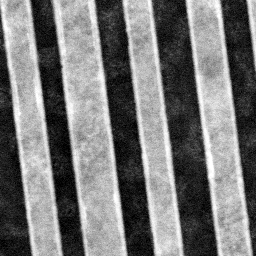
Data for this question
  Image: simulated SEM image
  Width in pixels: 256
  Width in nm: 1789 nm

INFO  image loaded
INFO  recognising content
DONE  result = one or a few lines or trenches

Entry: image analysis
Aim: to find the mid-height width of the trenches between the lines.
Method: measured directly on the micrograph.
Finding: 219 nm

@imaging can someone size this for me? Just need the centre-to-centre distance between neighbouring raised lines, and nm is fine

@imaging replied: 435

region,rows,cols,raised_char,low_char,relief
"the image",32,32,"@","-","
@@@----@@@@@----@@@-----@@@----@
@@@@---@@@@@----@@@-----@@@----@
-@@@---@@@@@----@@@-----@@@@---@
-@@@---@@@@@----@@@-----@@@@----
-@@@---@@@@@----@@@-----@@@@----
-@@@----@@@@----@@@-----@@@@----
-@@@----@@@@----@@@-----@@@@----
-@@@----@@@@-----@@@----@@@@----
-@@@@---@@@@@----@@@-----@@@----
-@@@@---@@@@@----@@@-----@@@----
--@@@---@@@@@----@@@-----@@@@---
--@@@---@@@@@----@@@-----@@@@---
--@@@---@@@@@----@@@-----@@@@---
--@@@----@@@@----@@@-----@@@@---
--@@@----@@@@----@@@-----@@@@---
--@@@----@@@@@---@@@@----@@@@---
--@@@@---@@@@@----@@@-----@@@---
--@@@@---@@@@@----@@@-----@@@---
---@@@---@@@@@----@@@-----@@@@--
---@@@---@@@@@----@@@-----@@@@--
---@@@---@@@@@----@@@-----@@@@--
---@@@----@@@@----@@@-----@@@@--
---@@@----@@@@----@@@-----@@@@--
---@@@----@@@@@---@@@@-----@@@--
---@@@@---@@@@@----@@@-----@@@--
---@@@@---@@@@@----@@@-----@@@--
----@@@---@@@@@----@@@-----@@@@-
----@@@---@@@@@----@@@-----@@@@-
----@@@---@@@@@----@@@-----@@@@-
----@@@----@@@@----@@@-----@@@@-
----@@@----@@@@----@@@-----@@@@-
----@@@----@@@@@----@@@-----@@@-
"